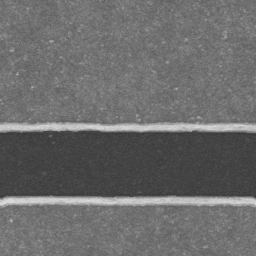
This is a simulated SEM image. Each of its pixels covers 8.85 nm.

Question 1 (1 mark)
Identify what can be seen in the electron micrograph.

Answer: one or a few lines or trenches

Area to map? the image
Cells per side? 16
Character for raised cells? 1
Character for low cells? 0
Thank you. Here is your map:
1111111111111111
1111111111111111
1111111111111111
1111111111111111
1111111111111111
1111111111111111
1111111111111111
1111111111111111
0000000000000000
0000000000000000
0000000000000000
0000000000000000
0000000000000000
1111111111111111
1111111111111111
1111111111111111